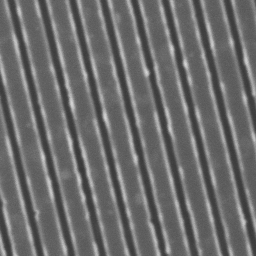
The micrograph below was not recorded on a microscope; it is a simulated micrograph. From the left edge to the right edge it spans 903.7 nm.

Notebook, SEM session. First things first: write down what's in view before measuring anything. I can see parallel lines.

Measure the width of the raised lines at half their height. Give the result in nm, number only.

77.7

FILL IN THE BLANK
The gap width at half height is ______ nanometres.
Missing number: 29.2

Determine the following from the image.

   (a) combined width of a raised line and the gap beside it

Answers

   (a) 106 nanometres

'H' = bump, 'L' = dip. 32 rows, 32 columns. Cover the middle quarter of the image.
HHHHHLLHHHHHHLLHHHHHLLLHHHHHLLHH
HHHHHLLHHHHHHLLHHHHHHLLHHHHHLLLH
HHHHHHLHHHHHHLLHHHHHHLLHHHHHHLLH
HHHHHHLLHHHHHLLLHHHHHLLHHHHHHLLH
HHHHHHLLHHHHHHLLHHHHHLLHHHHHHLLH
HHHHHHLLHHHHHHLLHHHHHHLLHHHHHLLL
LHHHHHLLHHHHHHLLHHHHHHLLHHHHHLLL
LHHHHHLLLHHHHHLLHHHHHHLLHHHHHHLL
LHHHHHHLLHHHHHHLLHHHHHLLLHHHHHLL
LHHHHHHLLHHHHHHLLHHHHHHLLHHHHHLL
LLHHHHHLLHHHHHHLLHHHHHHLLHHHHHHL
LLHHHHHHLLHHHHHLLHHHHHHLLHHHHHHL
LLHHHHHHLLHHHHHLLLHHHHHLLHHHHHHL
LLLHHHHHLLHHHHHHLLHHHHHHLLHHHHHL
HLLHHHHHLLHHHHHHLLHHHHHHLLHHHHHH
HLLHHHHHLLLHHHHHLLHHHHHHLLHHHHHH
HLLHHHHHHLLHHHHHLLLHHHHHLLHHHHHH
HLLHHHHHHLLHHHHHHLLHHHHHLLLHHHHH
HHLLHHHHHLLLHHHHHLLHHHHHLLLHHHHH
HHLLHHHHHLLLHHHHHLLHHHHHHLLHHHHH
HHLLHHHHHHLLHHHHHLLLHHHHHLLHHHHH
HHLLHHHHHHLLHHHHHHLLHHHHHLLLHHHH
HHLLHHHHHHLLHHHHHHLLHHHHHLLLHHHH
HHHLLHHHHHLLLHHHHHLLHHHHHHLLHHHH
HHHLLHHHHHHLLHHHHHLLLHHHHHLLHHHH
HHHLLHHHHHHLLHHHHHHLLHHHHHLLLHHH
HHHLLLHHHHHLLHHHHHHLLHHHHHHLLHHH
HHHHLLHHHHHLLHHHHHHLLHHHHHHLLHHH
HHHHLLHHHHHHLLHHHHHLLHHHHHHLLHHH
HHHHLLHHHHHHLLHHHHHLLLHHHHHLLHHH
HHHHLLLHHHHHLLHHHHHHLLHHHHHLLLHH
HHHHHLLHHHHHLLHHHHHHLLHHHHHHLLHH